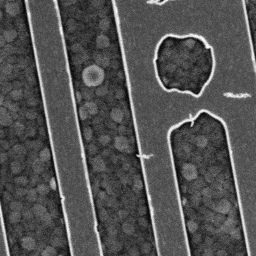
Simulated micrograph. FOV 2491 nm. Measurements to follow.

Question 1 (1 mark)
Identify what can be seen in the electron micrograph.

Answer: one or a few lines or trenches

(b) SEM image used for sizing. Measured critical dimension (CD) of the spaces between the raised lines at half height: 546 nm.